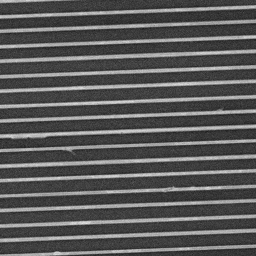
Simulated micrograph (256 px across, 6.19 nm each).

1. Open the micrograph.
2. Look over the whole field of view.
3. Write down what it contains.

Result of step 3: parallel lines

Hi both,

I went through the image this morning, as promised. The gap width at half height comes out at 75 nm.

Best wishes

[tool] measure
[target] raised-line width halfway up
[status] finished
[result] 2.75 pixels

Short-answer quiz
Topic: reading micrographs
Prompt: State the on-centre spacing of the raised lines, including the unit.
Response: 92.4 nanometers